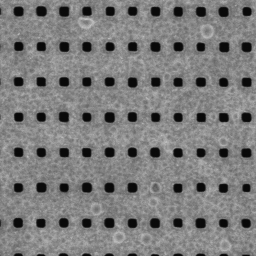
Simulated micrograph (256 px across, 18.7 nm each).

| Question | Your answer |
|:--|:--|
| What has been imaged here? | a regular array of holes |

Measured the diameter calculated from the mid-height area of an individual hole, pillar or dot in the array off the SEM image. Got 10.3 px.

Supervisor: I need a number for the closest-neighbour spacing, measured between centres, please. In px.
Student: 22.6